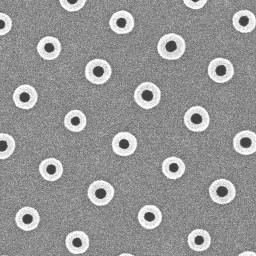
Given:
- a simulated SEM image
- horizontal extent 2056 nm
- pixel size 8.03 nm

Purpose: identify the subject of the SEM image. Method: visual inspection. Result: a regular array of ring-shaped raised bodies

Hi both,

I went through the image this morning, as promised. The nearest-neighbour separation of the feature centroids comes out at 435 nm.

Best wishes